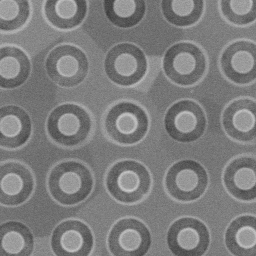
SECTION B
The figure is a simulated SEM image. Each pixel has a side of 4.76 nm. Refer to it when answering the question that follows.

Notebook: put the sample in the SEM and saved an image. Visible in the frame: an array of small figures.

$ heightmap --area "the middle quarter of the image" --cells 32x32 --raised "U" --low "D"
UUUDDDUUUUDDDUUUUUDDDUUUUDDUUUUU
UUUDDDUUUUDDDUUUUUDDDUUUUDDDUUUU
UUUDDDUUUUDDDDUUUDDDDUUUUDDDDDDD
DDDDDUUUUUUDDDDDDDDDUUUUUUDDDDDD
DDDDUUUUUUUUDDDDDDDUUUUUUUUDDDDD
DDDUUUUUUUUUUUDDDUUUUUUUUUUUUUDU
UUUUUUUUUUUUUUUUUUUUUUUUUUUUUUUU
UUUUUUUUUUUUUUUUUUUUUUUUUUUUUUUU
UUUUUUUUUUUUUUUUUUUUUUUUUUUUUUUU
UUUUUUUUUUUUUDDDDUUUUUUUUUUUDDDD
DDDDUUUUUUUUDDDDDDDUUUUUUUUDDDDD
DDDDDDUUUUUDDDDDDDDDUUUUUUDDDDDD
DDDDDDDUUUDDDDDDDDDDDUUUUDDDDUUU
UUUDDDDUUUDDDDUUUDDDDUUUUDDDUUUU
UUUUDDDUUUDDDUUUUUDDDUUUUDDDUUUU
UUUUDDDUUUDDDUUUUUDDDUUUUDDDUUUU
UUUDDDDUUUDDDDUUUDDDDUUUUDDDDUUU
UUUDDDDUUUDDDDDDDDDDDUUUUUDDDDDD
DDDDDDUUUUUDDDDDDDDDUUUUUUUDDDDD
DDDDDUUUUUUUDDDDDDDUUUUUUUUUUDDD
DDDDUUUUUUUUUUUUUUUUUUUUUUUUUUUU
UUUUUUUUUUUUUUUUUUUUUUUUUUUUUUUU
UUUUUUUUUUUUUUUUUUUUUUUUUUUUUUUU
UUUUUUUUUUUUUUUUUUUUUUUUUUUUUUUU
DDDDUUUUUUUUUDDDDDDUUUUUUUUUDDDD
DDDDDDUUUUUUDDDDDDDDUUUUUUUDDDDD
DDDDDDDUUUUDDDDDDDDDDUUUUUDDDDUU
UUUDDDDUUUUDDDDUUUDDDUUUUDDDDUUU
UUUUDDDDUUDDDDUUUUDDDDUUUDDDUUUU
UUUUDDDDUUDDDDUUUUUDDDUUUDDDUUUU
UUUUDDDUUUDDDDUUUUDDDDUUUDDDUUUU
UUUUDDDUUUUDDDDUUDDDDUUUUUDDDDUU